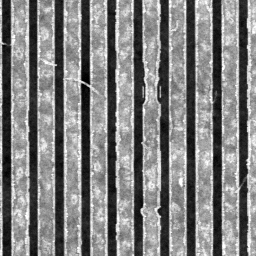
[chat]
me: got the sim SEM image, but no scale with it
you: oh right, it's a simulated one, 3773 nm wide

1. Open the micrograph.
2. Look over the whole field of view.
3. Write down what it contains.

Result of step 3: parallel lines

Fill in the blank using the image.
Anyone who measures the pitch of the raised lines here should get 388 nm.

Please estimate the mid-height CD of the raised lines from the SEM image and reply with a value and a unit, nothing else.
249 nanometres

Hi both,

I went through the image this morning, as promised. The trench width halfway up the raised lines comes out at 144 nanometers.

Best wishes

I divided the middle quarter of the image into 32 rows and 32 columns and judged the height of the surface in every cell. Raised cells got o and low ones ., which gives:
oooo...oooo..oooo...oooo...ooo..
oooo...oooo..oooo...ooo....ooo..
oooo...oooo..oooo...ooo....ooo..
oooo...oooo..oooo...oooo...ooo..
ooooo..oooo..oooo...ooo....ooo..
oooo..ooooo..oooo....oo....ooo..
oooo...oooo..oooo....oo....ooo..
oooo...oooo..oooo....oo....ooo..
oooo...oooo..oooo....oo....ooo..
oooo...oooo..oooo...oooo...ooo..
oooo...oooo..oooo...oooo...ooo..
oooo...oooo..oooo...oooo...ooo..
oooo...oooo..oooo...oooo...ooo..
oooo...oooo..oooo...oooo...ooo..
oooo...oooo..oooo...oooo...ooo..
oooo...oooo..oooo...oooo...ooo..
oooo...oooo..oooo...oooo...ooo..
oooo...oooo..oooo...oooo...ooo..
oooo...oooo..oooo...oooo...ooo..
oooo...oooo..oooo...oooo...ooo..
oooo...oooo..oooo...oooo...ooo..
oooo...oooo..oooo...oooo...ooo..
oooo...oooo..oooo...oooo...ooo..
oooo...oooo..oooo...oooo...ooo..
oooo...oooo..oooo...oooo...ooo..
oooo...oooo..oooo...oooo...ooo..
oooo...oooo..oooo...oooo...ooo..
oooo...oooo..oooo...oooo...ooo..
oooo...oooo..oooo...oooo...ooo..
oooo...oooo..oooo...oooo...ooo..
oooo...oooo..oooo...oooo...ooo..
oooo...oooo..oooo...oooo...ooo..